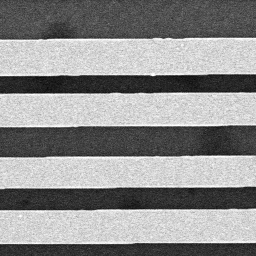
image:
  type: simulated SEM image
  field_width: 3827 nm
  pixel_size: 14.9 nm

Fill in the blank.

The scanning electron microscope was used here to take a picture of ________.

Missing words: lines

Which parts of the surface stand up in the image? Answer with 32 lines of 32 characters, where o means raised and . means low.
................................
................................
................................
................................
................................
oooooooooooooooooooooooooooooooo
oooooooooooooooooooooooooooooooo
oooooooooooooooooooooooooooooooo
oooooooooooooooooooooooooooooooo
................................
................................
................................
oooooooooooooooooooooooooooooooo
oooooooooooooooooooooooooooooooo
oooooooooooooooooooooooooooooooo
oooooooooooooooooooooooooooooooo
................................
................................
................................
................................
oooooooooooooooooooooooooooooooo
oooooooooooooooooooooooooooooooo
oooooooooooooooooooooooooooooooo
o...............................
................................
................................
oooooooooooooooooooooooooooooooo
oooooooooooooooooooooooooooooooo
oooooooooooooooooooooooooooooooo
oooooooooooooooooooooooooooooooo
................................
................................